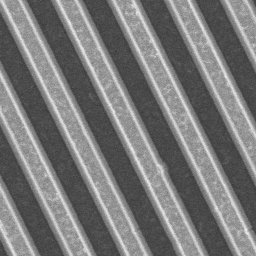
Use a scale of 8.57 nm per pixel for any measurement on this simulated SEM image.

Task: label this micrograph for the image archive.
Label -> parallel lines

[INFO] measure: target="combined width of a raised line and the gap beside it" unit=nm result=433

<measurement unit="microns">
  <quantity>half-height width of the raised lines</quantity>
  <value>0.187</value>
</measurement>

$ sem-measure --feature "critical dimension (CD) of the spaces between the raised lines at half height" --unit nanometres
244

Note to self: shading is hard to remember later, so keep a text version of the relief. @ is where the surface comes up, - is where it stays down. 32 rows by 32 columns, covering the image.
@@@----@@@----@@@----@@@----@@@-
-@@@----@@@----@@@----@@@----@@@
-@@@----@@@----@@@----@@@----@@@
--@@@----@@@----@@@----@@@----@@
--@@@----@@@----@@@----@@@----@@
---@@@----@@@----@@@----@@@----@
---@@@----@@@----@@@----@@@----@
----@@@----@@@----@@@----@@@----
----@@@----@@@----@@@----@@@----
-----@@-----@@-----@@@----@@@---
@----@@@----@@@----@@@----@@@---
@-----@@-----@@-----@@@----@@@--
@@----@@@----@@@----@@@----@@@--
@@----@@@----@@@-----@@@----@@@-
@@@----@@@----@@@----@@@----@@@-
@@@----@@@----@@@----@@@@----@@@
-@@@----@@@----@@@----@@@----@@@
-@@@----@@@----@@@----@@@@----@@
--@@@----@@@----@@@----@@@----@@
--@@@----@@@----@@@----@@@@----@
---@@@----@@@----@@@----@@@----@
---@@@----@@@----@@@@---@@@@----
----@@@----@@@----@@@----@@@----
----@@@----@@@----@@@----@@@@---
@----@@@----@@@----@@@----@@@---
@----@@@----@@@----@@@----@@@@--
@@----@@@----@@@----@@@----@@@--
@@----@@@----@@@----@@@----@@@@-
@@@----@@@----@@@----@@@----@@@-
@@@----@@@----@@@----@@@----@@@@
-@@@----@@@----@@@----@@@----@@@
-@@@----@@@----@@@----@@@----@@@